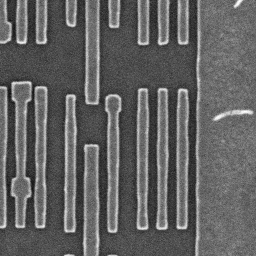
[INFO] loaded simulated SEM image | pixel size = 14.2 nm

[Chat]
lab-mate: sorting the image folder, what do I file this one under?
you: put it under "wiring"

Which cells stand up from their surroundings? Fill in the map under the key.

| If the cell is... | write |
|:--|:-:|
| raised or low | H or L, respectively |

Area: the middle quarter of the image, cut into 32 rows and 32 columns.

LLLLLLHHHLLLLLLLLLLLLLLLLLLLLLLL
LLLLLLHHHLLLLLLLLLLLLLLLLLLLLLLL
LLLLLLHHHLLLLLLLLLLLLLLLLLLLLLLL
LLLLLLHHHLLLLLLLLLLLLLLLLLLLLLLL
LLLLLHHHHLLLLLLLLLLLLLLLLLLLLLLL
LLLLLHHHHLLLLLLLLLLLLLLLLLLLLLLL
LLLLLHHHHLLLLLLLLLLHHLLLHLLLLHLL
LLLLLHHHHLLLLLLLLLLHHLLLHHLLLHHL
LHHLLLHHHLLHHHLLLLLHHLLLHHLLLHHL
LHHLLLHHLLLHHHLLLLLHHLLLHHLLLHHL
LHLLLLLLLLLHHHLLLLLHHLLLHHLLHHHL
LHLLLLLLLLLHHHLLLLLHHLLLHHLLHHHL
LHLLLLLLLLLHHHLLLLLHHLLLHHLLHHHL
LHHLLLLLLLLHHLLLLLLHHLLLHHLLHHHL
HHHLLLLLLLLHHLLLLLLHHLLLHHLLHHHL
HHHLLLLLLLLHHLLLLLLHHLLLHHLLHHHL
HHHLLLLLLLLHHHLLLLLHHLLLHHLLHHHL
HHHLLLLLLLLHHHLLLLLHHLLLHHLLHHHL
HHHLLLLLLLLHHHLLLLLHHLLLHHLLHHHL
HHHLLLLLLLLHHHLLLLLHHLLHHHLLHHHL
HHHLLHHHLLLHHHLLLLLHHLLHHHLLHHHL
HHHLLHHHHLLHHHLLLLLHHLLHHHLLHHHL
HHHLLHHHLLLHHHLLLLLHHLLHHHLLHHHL
HHHLLHHHLLLHHHLLLLLHHLLHHHLLHHHL
HHHLLHHHLLLHHHLLLLLHHLLHHHLLHHHL
HHHLLHHHLLLHHHLLLLLHHLLHHHLLHHHL
HHHLLHHHLLLHHLLLLLLHHLLLHHLLHHHL
HHHLLHHHLLLHHLLLLLLHHLLLHHLLHHHL
HHHLLHHHLLLHHLLLLLLHHLLLHHLLHHHL
HHHLLHHHLLLHHLLLLLLHHLLLHLLLHHHL
HHHLLHHHLLLHHLLLLLLHHLLLHLLLHHHL
HHHLLHHHLLLHHLLLLLLHHLLLHLLLHHHL